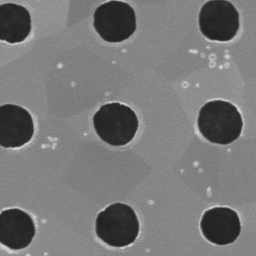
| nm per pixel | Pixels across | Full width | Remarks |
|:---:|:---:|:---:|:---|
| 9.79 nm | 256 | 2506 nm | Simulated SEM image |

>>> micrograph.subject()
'holes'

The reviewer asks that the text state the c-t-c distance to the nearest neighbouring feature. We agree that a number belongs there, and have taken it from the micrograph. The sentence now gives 1 micrometres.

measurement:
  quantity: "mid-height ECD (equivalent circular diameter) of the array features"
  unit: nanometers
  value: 428